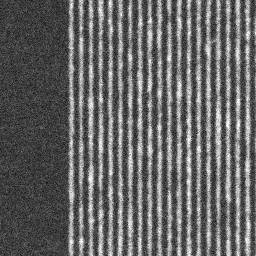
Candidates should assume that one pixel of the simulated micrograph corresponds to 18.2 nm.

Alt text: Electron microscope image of parallel lines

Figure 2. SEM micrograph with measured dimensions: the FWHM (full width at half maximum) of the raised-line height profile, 50.1 nm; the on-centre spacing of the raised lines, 178 nanometers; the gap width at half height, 0.132 microns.